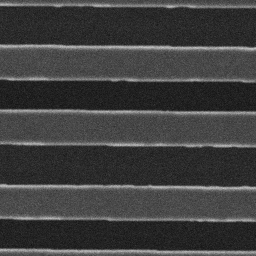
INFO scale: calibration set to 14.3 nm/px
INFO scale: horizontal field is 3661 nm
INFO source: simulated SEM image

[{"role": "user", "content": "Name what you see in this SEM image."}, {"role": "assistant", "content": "lines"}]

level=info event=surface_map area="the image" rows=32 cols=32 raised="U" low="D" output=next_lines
UUUUUUUUUUUUUUUUUUUUUUUUUUUUUUUU
DDDDDDDDDDDDDDDDDDDDDDDDDDDDDDDD
DDDDDDDDDDDDDDDDDDDDDDDDDDDDDDDD
DDDDDDDDDDDDDDDDDDDDDDDDDDDDDDDD
DDDDDDDDDDDDDDDDDDDDDDDDDDDDDDDD
DDDDDDDDDDDDDDDDDDDDDDDDDDDDDDDD
UUUUUUUUUUUUUUUUUUUUUUUUUUUUUUUU
UUUUUUUUUUUUUUUUUUUUUUUUUUUUUUUU
UUUUUUUUUUUUUUUUUUUUUUUUUUUUUUUU
UUUUUUUUUUUUUUUUUUUUUUUUUUUUUUUU
DDDDDDDDDDDDDDDDDDDDDDDDDDDDDDDD
DDDDDDDDDDDDDDDDDDDDDDDDDDDDDDDD
DDDDDDDDDDDDDDDDDDDDDDDDDDDDDDDD
DDDDDDDDDDDDDDDDDDDDDDDDDDDDDDDD
UUUUUUUUUUUUUUUUUUUUUUUUUUUUUUUU
UUUUUUUUUUUUUUUUUUUUUUUUUUUUUUUU
UUUUUUUUUUUUUUUUUUUUUUUUUUUUUUUU
UUUUUUUUUUUUUUUUUUUUUUUUUUUUUUUU
DDDDDDDDDDDDDDDDDDDDDDDDDDDDDDDD
DDDDDDDDDDDDDDDDDDDDDDDDDDDDDDDD
DDDDDDDDDDDDDDDDDDDDDDDDDDDDDDDD
DDDDDDDDDDDDDDDDDDDDDDDDDDDDDDDD
DDDDDDDDDDDDDDDDDDDDDDDDDDDDDDDD
UUUUUUUUUUUUUUUUUUUUUUUUUUUUUUUU
UUUUUUUUUUUUUUUUUUUUUUUUUUUUUUUU
UUUUUUUUUUUUUUUUUUUUUUUUUUUUUUUU
UUUUUUUUUUUUUUUUUUUUUUUUUUUUUUUU
DDDDDDDDDDDDDUUUUUUUUUUUUUUUUUUU
DDDDDDDDDDDDDDDDDDDDDDDDDDDDDDDD
DDDDDDDDDDDDDDDDDDDDDDDDDDDDDDDD
DDDDDDDDDDDDDDDDDDDDDDDDDDDDDDDD
UUUUUUUUUUUUUUUUUUUUUUUUUUUUUUUU